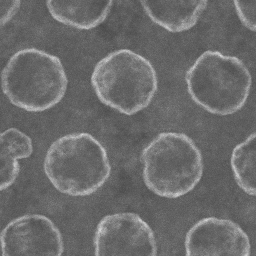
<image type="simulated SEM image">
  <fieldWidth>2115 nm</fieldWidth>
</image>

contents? raised bodies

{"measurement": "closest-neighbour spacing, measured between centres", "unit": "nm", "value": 773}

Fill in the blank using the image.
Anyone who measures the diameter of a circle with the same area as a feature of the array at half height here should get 488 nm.